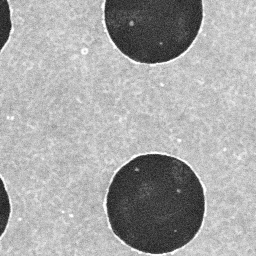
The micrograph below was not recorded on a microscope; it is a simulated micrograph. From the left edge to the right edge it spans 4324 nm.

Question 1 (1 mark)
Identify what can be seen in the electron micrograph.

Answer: holes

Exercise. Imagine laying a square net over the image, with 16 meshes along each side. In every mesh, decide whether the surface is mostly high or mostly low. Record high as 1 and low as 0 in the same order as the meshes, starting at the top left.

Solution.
0111111000000111
0111111000000111
1111111000001111
1111111100011111
1111111111111111
1111111111111111
1111111111111111
1111111111111111
1111111111111111
1111111111111111
1111111100001111
1111111000000111
0111111000000111
0111111000000111
1111111000001111
1111111100011111